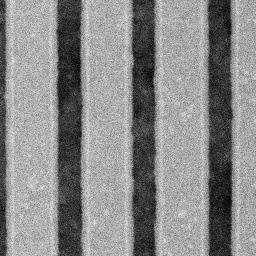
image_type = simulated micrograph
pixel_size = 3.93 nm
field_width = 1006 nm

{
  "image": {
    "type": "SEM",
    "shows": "one or a few lines or trenches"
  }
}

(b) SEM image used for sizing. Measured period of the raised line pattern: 295 nm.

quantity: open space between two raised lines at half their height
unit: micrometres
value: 0.121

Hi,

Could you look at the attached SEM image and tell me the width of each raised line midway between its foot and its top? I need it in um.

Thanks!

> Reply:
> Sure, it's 0.174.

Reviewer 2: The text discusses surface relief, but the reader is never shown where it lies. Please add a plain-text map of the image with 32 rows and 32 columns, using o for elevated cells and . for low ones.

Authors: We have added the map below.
.oooooo....ooooo....ooooo....ooo
.oooooo....ooooo....ooooo....ooo
.oooooo....ooooo....oooooo...ooo
.oooooo....ooooo....oooooo...ooo
.oooooo....ooooo....oooooo...ooo
.oooooo....ooooo....oooooo...ooo
.oooooo....ooooo....oooooo...ooo
.oooooo....ooooo....oooooo...ooo
.oooooo....ooooo....oooooo...ooo
.oooooo....ooooo....oooooo...ooo
.oooooo....ooooo....oooooo...ooo
.oooooo....ooooo....ooooo....ooo
.oooooo....ooooo....oooooo...ooo
.oooooo....ooooo....oooooo...ooo
.oooooo....ooooo....oooooo....oo
.oooooo....ooooo....oooooo....oo
.oooooo....ooooo....oooooo....oo
.oooooo....ooooo....oooooo....oo
.oooooo....ooooo....oooooo....oo
.oooooo....ooooo....oooooo....oo
.oooooo....ooooo....oooooo....oo
.oooooo....ooooo....oooooo....oo
.oooooo....ooooo....oooooo...ooo
.oooooo....ooooo....oooooo....oo
.oooooo....ooooo....oooooo....oo
.oooooo....ooooo....oooooo....oo
.oooooo....ooooo....oooooo...ooo
.oooooo....ooooo....oooooo...ooo
.oooooo....ooooo....oooooo...ooo
.oooooo....ooooo....oooooo...ooo
.oooooo....ooooo....oooooo...ooo
.oooooo....ooooo....oooooo...ooo